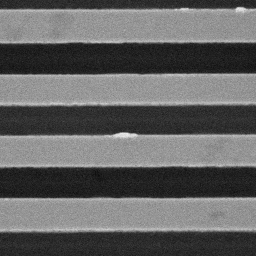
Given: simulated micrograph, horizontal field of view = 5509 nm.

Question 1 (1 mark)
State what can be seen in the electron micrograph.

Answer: lines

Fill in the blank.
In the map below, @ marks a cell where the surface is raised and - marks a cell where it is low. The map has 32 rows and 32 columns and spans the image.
--------------------------------
@@@@@@@@@@@@@@@@@@@@@@@@@@@@@@@@
@@@@@@@@@@@@@@@@@@@@@@@@@@@@@@@@
@@@@@@@@@@@@@@@@@@@@@@@@@@@@@@@@
@@@@@@@@@@@@@@@@@@@@@@@@@@@@@@@@
--------------------------------
--------------------------------
--------------------------------
--------------------------------
@@@@@@@@@@@@@@@@@@@@@@@@@@@@@@@@
@@@@@@@@@@@@@@@@@@@@@@@@@@@@@@@@
@@@@@@@@@@@@@@@@@@@@@@@@@@@@@@@@
@@@@@@@@@@@@@@@@@@@@@@@@@@@@@@@@
--------------------------------
--------------------------------
--------------------------------
--------------------------------
@@@@@@@@@@@@@@@@@@@@@@@@@@@@@@@@
@@@@@@@@@@@@@@@@@@@@@@@@@@@@@@@@
@@@@@@@@@@@@@@@@@@@@@@@@@@@@@@@@
@@@@@@@@@@@@@@@@@@@@@@@@@@@@@@@@
--------------------------------
--------------------------------
--------------------------------
--------------------------------
@@@@@@@@@@@@@@@@@@@@@@@@@@@@@@@@
@@@@@@@@@@@@@@@@@@@@@@@@@@@@@@@@
@@@@@@@@@@@@@@@@@@@@@@@@@@@@@@@@
@@@@@@@@@@@@@@@@@@@@@@@@@@@@@@@@
--------------------------------
--------------------------------
--------------------------------